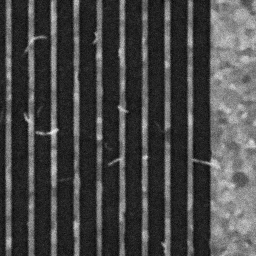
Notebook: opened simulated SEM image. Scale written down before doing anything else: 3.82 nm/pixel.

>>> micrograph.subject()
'parallel lines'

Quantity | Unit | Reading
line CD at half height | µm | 0.0167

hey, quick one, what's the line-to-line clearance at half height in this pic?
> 0.0697 micrometres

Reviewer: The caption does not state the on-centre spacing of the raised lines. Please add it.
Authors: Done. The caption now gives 86.8 nanometres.